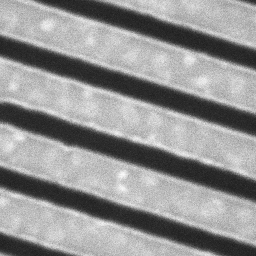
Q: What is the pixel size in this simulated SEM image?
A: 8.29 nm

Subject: one or a few lines or trenches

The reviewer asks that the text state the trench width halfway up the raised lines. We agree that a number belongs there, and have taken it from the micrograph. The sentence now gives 294 nm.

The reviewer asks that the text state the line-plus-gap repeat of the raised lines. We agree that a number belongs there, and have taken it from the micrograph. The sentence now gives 519 nm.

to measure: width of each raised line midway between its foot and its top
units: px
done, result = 27.1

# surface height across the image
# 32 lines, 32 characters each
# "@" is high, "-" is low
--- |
----@@@@@@@@@@@---------------@@
-------@@@@@@@@@@@@-------------
----------@@@@@@@@@@@-----------
--------------@@@@@@@@@@@-------
@@---------------@@@@@@@@@@@----
@@@@@---------------@@@@@@@@@@@-
@@@@@@@@---------------@@@@@@@@@
@@@@@@@@@@@----------------@@@@@
---@@@@@@@@@@@@---------------@@
------@@@@@@@@@@@@--------------
----------@@@@@@@@@@@-----------
-------------@@@@@@@@@@@--------
@---------------@@@@@@@@@@@-----
@@@@@--------------@@@@@@@@@@@@-
@@@@@@@@---------------@@@@@@@@@
@@@@@@@@@@@---------------@@@@@@
--@@@@@@@@@@@@---------------@@@
-----@@@@@@@@@@@@@--------------
--------@@@@@@@@@@@@@-----------
------------@@@@@@@@@@@@--------
---------------@@@@@@@@@@@@-----
@@@---------------@@@@@@@@@@@@--
@@@@@@@---------------@@@@@@@@@@
@@@@@@@@@@---------------@@@@@@@
--@@@@@@@@@@@---------------@@@@
------@@@@@@@@@@---------------@
---------@@@@@@@@@@@------------
------------@@@@@@@@@@@---------
---------------@@@@@@@@@@@------
@@@---------------@@@@@@@@@@@---
@@@@@@---------------@@@@@@@@@@@
@@@@@@@@@---------------@@@@@@@@